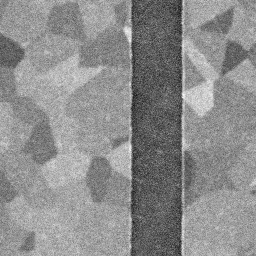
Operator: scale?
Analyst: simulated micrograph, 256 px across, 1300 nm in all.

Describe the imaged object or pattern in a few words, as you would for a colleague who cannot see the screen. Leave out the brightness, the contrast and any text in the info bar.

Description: one or a few lines or trenches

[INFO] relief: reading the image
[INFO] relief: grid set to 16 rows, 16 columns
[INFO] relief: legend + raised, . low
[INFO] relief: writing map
++++++++...+++++
++++++++...+++++
++++++++...+++++
++++++++...+++++
++++++++...+++++
++++++++...+++++
++++++++...+++++
++++++++...+++++
++++++++...+++++
++++++++...+++++
++++++++...+++++
++++++++...+++++
++++++++...+++++
++++++++...+++++
++++++++...+++++
++++++++...+++++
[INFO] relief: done